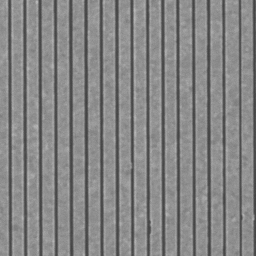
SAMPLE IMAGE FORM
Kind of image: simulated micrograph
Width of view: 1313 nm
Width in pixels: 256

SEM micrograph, parallel lines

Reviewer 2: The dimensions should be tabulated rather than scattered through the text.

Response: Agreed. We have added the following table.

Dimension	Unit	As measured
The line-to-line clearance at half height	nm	21.8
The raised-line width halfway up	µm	0.0571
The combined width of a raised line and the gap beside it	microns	0.0785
